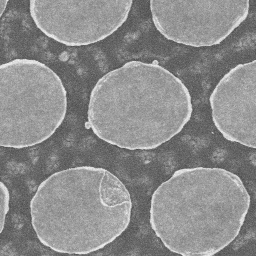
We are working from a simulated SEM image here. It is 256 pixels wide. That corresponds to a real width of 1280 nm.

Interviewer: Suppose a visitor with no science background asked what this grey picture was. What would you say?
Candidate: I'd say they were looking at raised bodies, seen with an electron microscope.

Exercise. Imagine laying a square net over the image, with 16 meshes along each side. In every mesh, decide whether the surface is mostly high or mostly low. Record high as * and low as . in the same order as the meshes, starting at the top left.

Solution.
..******.******.
..******..*****.
....**.....***..
................
***....****...**
****..******..**
****..******.***
****..******.***
***...*****...**
................
................
...***....*****.
..****....******
..******..*****.
..******..*****.
...***.....***..